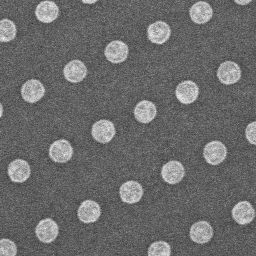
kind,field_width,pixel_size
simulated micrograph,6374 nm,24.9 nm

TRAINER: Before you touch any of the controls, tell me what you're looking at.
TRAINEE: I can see a regular array of raised bodies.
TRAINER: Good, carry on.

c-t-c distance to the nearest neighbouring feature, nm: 1150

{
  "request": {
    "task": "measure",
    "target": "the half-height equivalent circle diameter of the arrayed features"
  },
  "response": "21.7 px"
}